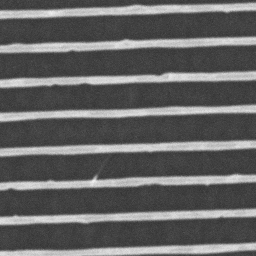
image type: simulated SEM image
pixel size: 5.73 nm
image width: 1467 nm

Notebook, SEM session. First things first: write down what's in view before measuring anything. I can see parallel lines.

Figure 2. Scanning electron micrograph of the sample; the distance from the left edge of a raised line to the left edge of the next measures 197 nanometers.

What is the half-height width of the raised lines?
6.49 px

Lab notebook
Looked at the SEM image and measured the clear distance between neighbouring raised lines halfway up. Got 161 nm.